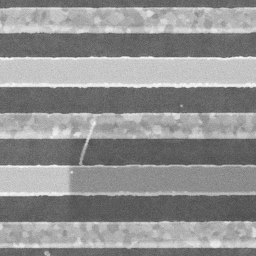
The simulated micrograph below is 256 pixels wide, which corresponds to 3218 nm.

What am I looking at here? lines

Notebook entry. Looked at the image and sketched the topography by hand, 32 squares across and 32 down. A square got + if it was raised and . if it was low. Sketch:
................................
++++++++++++++++++++++++++++++++
++++++++++++++++++++++++++++++++
++++++++++++++++++++++++++++++++
................................
................................
................................
++++++++++++++++++++++++++++++++
++++++++++++++++++++++++++++++++
++++++++++++++++++++++++++++++++
++++++++++++++++++++++++++++++++
................................
................................
................................
++++++++++++++++++++++++++++++++
++++++++++++++++++++++++++++++++
++++++++++++++++++++++++++++++++
................................
................................
................................
................................
++++++++++++++++++++++++++++++++
++++++++++++++++++++++++++++++++
++++++++++++++++++++++++++++++++
................................
................................
................................
................................
++++++++++++++++++++++++++++++++
++++++++++++++++++++++++++++++++
++++++++++++++++++++++++++++++++
................................